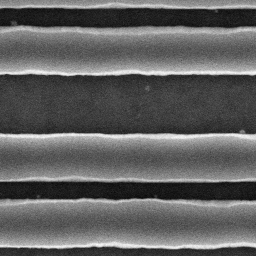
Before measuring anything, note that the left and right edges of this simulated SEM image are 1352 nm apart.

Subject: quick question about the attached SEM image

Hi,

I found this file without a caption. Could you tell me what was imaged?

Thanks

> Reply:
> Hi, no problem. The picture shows lines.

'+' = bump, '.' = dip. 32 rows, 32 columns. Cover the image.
++++++++++++++++++++++++++++++++
................................
................................
.+++............................
++++++++++++++++++++++++++++++++
++++++++++++++++++++++++++++++++
++++++++++++++++++++++++++++++++
++++++++++++++++++++++++++++++++
++++++++++++++++++++++++++++++++
................................
................................
................................
................................
................................
................................
................................
................................
++++++++++++++++++++++++++++++++
++++++++++++++++++++++++++++++++
++++++++++++++++++++++++++++++++
++++++++++++++++++++++++++++++++
++++++++++++++++++++++++++++++++
++++.+++..++++++++++++++++++++++
................................
................................
++++++++++++++++++++++++++++++++
++++++++++++++++++++++++++++++++
++++++++++++++++++++++++++++++++
++++++++++++++++++++++++++++++++
++++++++++++++++++++++++++++++++
++++++++++++++++++++++++++++++++
................................